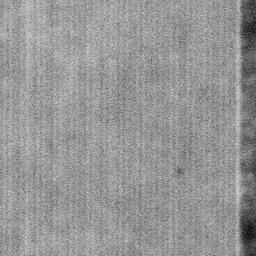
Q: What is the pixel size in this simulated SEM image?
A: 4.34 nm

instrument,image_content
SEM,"parallel lines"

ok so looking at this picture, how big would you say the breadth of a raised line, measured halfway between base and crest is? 12.5 nm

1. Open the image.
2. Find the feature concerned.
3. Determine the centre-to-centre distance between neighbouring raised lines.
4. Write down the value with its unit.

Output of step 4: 0.0241 µm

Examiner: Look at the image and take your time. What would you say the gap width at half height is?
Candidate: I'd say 0.0125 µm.